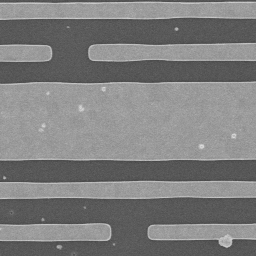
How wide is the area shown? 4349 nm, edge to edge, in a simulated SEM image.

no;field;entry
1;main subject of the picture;groups of lines, slits or small figures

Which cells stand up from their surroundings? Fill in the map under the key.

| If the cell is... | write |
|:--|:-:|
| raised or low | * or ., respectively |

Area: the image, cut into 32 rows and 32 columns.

********************************
********************************
................................
................................
................................
.............................***
******.....*********************
******......******...***********
................................
................................
.*******************************
********************************
********************************
********************************
********************************
********************************
********************************
********************************
********************************
********************************
................................
................................
................................
********************************
********************************
................................
................................
................................
**************.....*************
**************.....*************
............................*...
................................